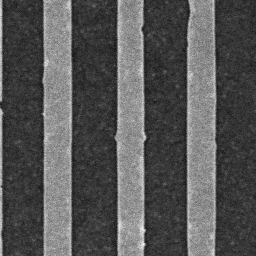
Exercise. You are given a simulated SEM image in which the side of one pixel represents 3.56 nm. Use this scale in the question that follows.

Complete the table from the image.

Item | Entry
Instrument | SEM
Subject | one or a few lines or trenches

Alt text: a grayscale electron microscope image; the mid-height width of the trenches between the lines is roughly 158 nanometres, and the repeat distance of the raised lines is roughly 256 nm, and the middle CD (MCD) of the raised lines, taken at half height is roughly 96.5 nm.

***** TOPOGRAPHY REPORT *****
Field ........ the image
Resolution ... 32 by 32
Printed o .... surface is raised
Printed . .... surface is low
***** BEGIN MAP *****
......ooo......ooo......ooo.....
......ooo......ooo......ooo.....
......ooo......ooo......ooo.....
......ooo......ooo......ooo.....
......ooo......ooo......ooo.....
......ooo......ooo......ooo.....
......ooo......ooo......ooo.....
......ooo......ooo......ooo.....
.....oooo......ooo......ooo.....
.....oooo......ooo......ooo.....
.....oooo......ooo......ooo.....
......ooo......ooo......ooo.....
......ooo......ooo......ooo.....
......ooo......ooo......ooo.....
.....oooo......ooo......ooo.....
......ooo......ooo......ooo.....
......ooo......ooo......ooo.....
......ooo......ooo......ooo.....
......ooo......ooo......ooo.....
......ooo......ooo......ooo.....
......ooo......ooo......ooo.....
......ooo......ooo......ooo.....
......ooo......ooo......ooo.....
......ooo......ooo......ooo.....
......ooo......ooo......ooo.....
......ooo......ooo......ooo.....
......ooo......ooo......ooo.....
......ooo......ooo......ooo.....
......ooo......ooo......ooo.....
......ooo......ooo......ooo.....
......ooo......ooo......ooo.....
......ooo......ooo......ooo.....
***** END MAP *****